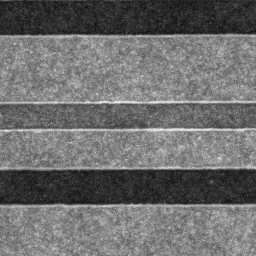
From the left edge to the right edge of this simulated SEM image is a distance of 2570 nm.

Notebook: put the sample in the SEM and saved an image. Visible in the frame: lines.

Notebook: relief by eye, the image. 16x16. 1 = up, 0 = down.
0000000000000000
0000000000000000
1111111111111111
1111111111111111
1111111111111111
1111111111111111
1111111111111111
1111111111111111
1111111111111111
1111111111111111
1111111111111111
0000000000000000
0000000000000000
1111111111111111
1111111111111111
1111111111111111